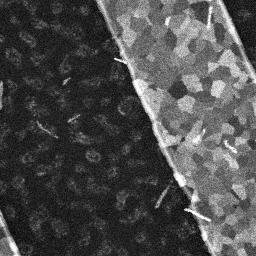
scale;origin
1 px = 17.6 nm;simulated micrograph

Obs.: one or a few lines or trenches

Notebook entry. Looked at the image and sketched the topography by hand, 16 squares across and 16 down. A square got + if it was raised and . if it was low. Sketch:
......++++++++..
.......+++++++..
.......++++++++.
........+++++++.
........++++++++
.........+++++++
.........+++++++
..........++++++
..........++++++
..........++++++
...........+++++
...........+++++
............++++
............++++
.............+++
+............+++